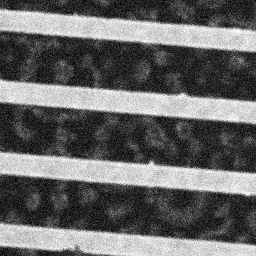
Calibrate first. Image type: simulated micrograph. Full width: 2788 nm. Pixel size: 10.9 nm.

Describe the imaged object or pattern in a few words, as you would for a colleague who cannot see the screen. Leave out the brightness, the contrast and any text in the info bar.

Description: one or a few lines or trenches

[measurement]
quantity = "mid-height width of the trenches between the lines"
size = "560 nanometers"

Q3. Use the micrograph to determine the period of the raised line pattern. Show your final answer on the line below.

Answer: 776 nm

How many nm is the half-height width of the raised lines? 217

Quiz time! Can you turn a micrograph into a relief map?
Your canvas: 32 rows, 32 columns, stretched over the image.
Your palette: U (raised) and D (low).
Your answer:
DDDDDDDDDDDDDDDDDDDDDDDDDDDDDDDD
UDDDDDDDDDDDDDDDDDDDDDDDDDDDDDDD
UUUUUUUUUUUUUDDDDDDDDDDDDDDDDDDD
UUUUUUUUUUUUUUUUUUUUUUUUUUUDDDDD
DDDDDDDDDUUUUUUUUUUUUUUUUUUUUUUU
DDDDDDDDDDDDDDDDDDDDDUUUUUUUUUUU
DDDDDDDDDDDDDDDDDDDDDDDDDDDDDDDD
DDDDDDDDDDDDDDDDDDDDDDDDDDDDDDDD
DDDDDDDDDDDDDDDDDDDDDDDDDDDDDDDD
DDDDDDDDDDDDDDDDDDDDDDDDDDDDDDDD
UUUUDDDDDDDDDDDDDDDDDDDDDDDDDDDD
UUUUUUUUUUUUUUUDDDDDDDDDDDDDDDDD
UUUUUUUUUUUUUUUUUUUUUUUUUUUUDDDD
DDDDDDDDDDUUUUUUUUUUUUUUUUUUUUUU
DDDDDDDDDDDDDDDDDDDDDDUUUUUUUUUU
DDDDDDDDDDDDDDDDDDDDDDDDDDDDDDDD
DDDDDDDDDDDDDDDDDDDDDDDDDDDDDDDD
DDDDDDDDDDDDDDDDDDDDDDDDDDDDDDDD
DDDDDDDDDDDDDDDDDDDDDDDDDDDDDDDD
UUUUDDDDDDDDDDDDDDDDDDDDDDDDDDDD
UUUUUUUUUUUUUUUUDDDDDDDDDDDDDDDD
UUUUUUUUUUUUUUUUUUUUUUUUUUUUDDDD
DDDDDDDDDDDUUUUUUUUUUUUUUUUUUUUU
DDDDDDDDDDDDDDDDDDDDDDUUUUUUUUUU
DDDDDDDDDDDDDDDDDDDDDDDDDDDDDDDD
DDDDDDDDDDDDDDDDDDDDDDDDDDDDDDDD
DDDDDDDDDDDDDDDDDDDDDDDDDDDDDDDD
DDDDDDDDDDDDDDDDDDDDDDDDDDDDDDDD
UUUUDDDDDDDDDDDDDDDDDDDDDDDDDDDD
UUUUUUUUUUUUUUUUUDDDDDDDDDDDDDDD
UUUUUUUUUUUUUUUUUUUUUUUUUUUUUDDD
DDDDDDDDDDDUUUUUUUUUUUUUUUUUUUUU